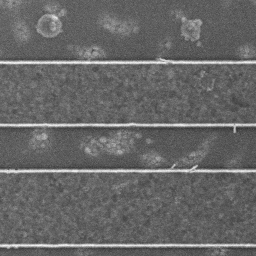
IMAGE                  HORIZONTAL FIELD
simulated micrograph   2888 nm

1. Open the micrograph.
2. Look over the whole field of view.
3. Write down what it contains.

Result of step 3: one or a few lines or trenches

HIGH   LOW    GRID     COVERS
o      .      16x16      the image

................
................
................
................
oooooooooooooooo
oooooooooooooooo
oooooooooooooooo
oooooooooooooooo
................
................
................
oooooooooooooooo
oooooooooooooooo
oooooooooooooooo
oooooooooooooooo
................